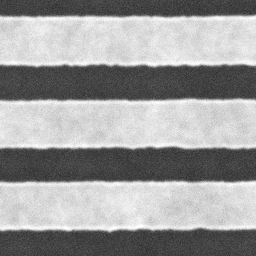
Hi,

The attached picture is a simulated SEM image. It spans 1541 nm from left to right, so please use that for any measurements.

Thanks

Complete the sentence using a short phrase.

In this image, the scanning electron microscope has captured lines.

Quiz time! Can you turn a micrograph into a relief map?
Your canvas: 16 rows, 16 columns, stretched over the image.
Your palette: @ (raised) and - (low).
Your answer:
----------------
@@@@@@@@@@@@@@@@
@@@@@@@@@@@@@@@@
@@@@@@@@@@@@@@@@
----------------
----------------
@@@@@@@@@@@@@@@@
@@@@@@@@@@@@@@@@
@@@@@@@@@@@@@@@@
----------------
----------------
@@@@@@@@@@@@@@@@
@@@@@@@@@@@@@@@@
@@@@@@@@@@@@@@@@
----------------
----------------